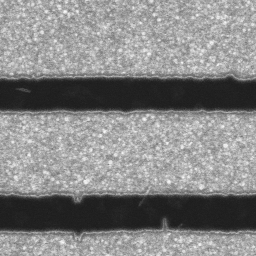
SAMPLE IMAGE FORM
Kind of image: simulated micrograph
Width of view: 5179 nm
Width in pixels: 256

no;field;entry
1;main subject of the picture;one or a few lines or trenches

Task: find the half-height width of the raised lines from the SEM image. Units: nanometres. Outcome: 723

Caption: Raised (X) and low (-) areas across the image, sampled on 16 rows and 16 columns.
----------------
----------------
----------------
----------------
----------------
XXXXXXXXXXXXXXXX
XXXXXXXXXXXXXXXX
----------------
----------------
----------------
----------------
----------------
XXXXXXXXXXXXXXXX
XXXXXXXXXXXXXXXX
XXXXXXX-X---XXX-
----------------